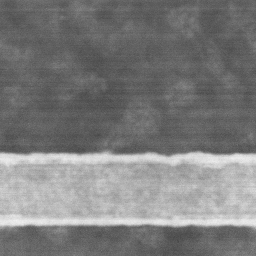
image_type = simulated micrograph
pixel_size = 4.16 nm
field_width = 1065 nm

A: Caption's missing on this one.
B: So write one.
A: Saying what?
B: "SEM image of one or a few lines or trenches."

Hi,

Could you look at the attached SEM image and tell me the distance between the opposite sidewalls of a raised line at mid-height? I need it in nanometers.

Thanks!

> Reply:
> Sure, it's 274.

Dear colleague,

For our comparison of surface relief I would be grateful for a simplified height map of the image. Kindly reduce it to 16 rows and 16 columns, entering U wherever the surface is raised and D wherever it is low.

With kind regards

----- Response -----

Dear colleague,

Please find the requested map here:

DDDDDDDDDDDDDDDD
DDDDDDDDDDDDDDDD
DDDDDDDDDDDDDDDD
DDDDDDDDDDDDDDDD
DDDDDDDDDDDDDDDD
DDDDDDDDDDDDDDDD
DDDDDDDDDDDDDDDD
DDDDDDDDDDDDDDDD
DDDDDDDDDDDDDDDD
DDDDDDDDDDDDDDDD
UUUUUUUUUUUUUUUU
UUUUUUUUUUUUUUUU
UUUUUUUUUUUUUUUU
UUUUUUUUUUUUUUUU
DDDDDDDDDDDDDDDD
DDDDDDDDDDDDDDDD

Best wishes